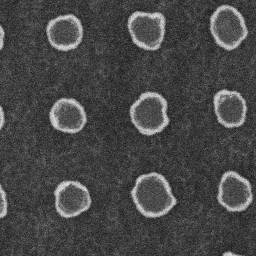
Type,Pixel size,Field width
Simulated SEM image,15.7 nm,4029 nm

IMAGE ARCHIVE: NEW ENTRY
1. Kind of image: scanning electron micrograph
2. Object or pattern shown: a regular array of raised bodies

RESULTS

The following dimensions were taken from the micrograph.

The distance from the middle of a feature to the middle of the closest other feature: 1280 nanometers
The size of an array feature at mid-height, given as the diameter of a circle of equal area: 540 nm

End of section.